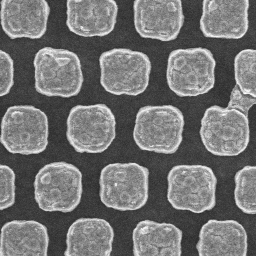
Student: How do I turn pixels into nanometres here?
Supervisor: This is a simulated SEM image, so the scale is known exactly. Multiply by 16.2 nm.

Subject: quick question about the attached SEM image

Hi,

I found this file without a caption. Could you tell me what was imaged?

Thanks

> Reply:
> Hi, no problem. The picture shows a regular array of raised bodies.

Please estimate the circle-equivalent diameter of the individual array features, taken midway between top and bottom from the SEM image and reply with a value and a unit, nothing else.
49.4 pixels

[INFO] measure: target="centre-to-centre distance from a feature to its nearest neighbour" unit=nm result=1060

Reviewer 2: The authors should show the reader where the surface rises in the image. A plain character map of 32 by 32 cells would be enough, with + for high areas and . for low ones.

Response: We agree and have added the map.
++++++..++++++...++++++..++++++.
++++++...++++++..++++++..++++++.
++++++..++++++...++++++..++++++.
++++++...+++++...+++++...++++++.
..+++.....++......++++....++++..
................................
.....++++.....+++.....++++....++
+...++++++...+++++...++++++..+++
++..++++++...++++++..++++++..+++
++..++++++...++++++..++++++..+++
+....+++++...+++++...++++++..+++
+....+++++....++++....++++...+++
.............................+++
.+++.....++++.....++++....+.+++.
.+++++...+++++...++++++...+++++.
++++++..++++++...++++++..++++++.
++++++...+++++...++++++..++++++.
++++++...+++++...++++++..++++++.
.+++++...++++.....++++....+++++.
................................
.......+........+...............
++...+++++...+++++...+++++....++
++..++++++...+++++...++++++...++
++..++++++...+++++...++++++...++
++..++++++...+++++...++++++..+++
+....+++++...+++++...++++++...++
........................+.......
..........+++...................
+++++....+++++...+++++...+++++..
++++++..++++++...++++++..++++++.
++++++..++++++...++++++..++++++.
++++++..++++++...++++++..++++++.